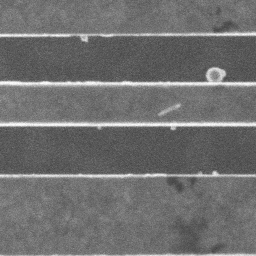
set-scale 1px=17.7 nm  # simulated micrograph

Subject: lines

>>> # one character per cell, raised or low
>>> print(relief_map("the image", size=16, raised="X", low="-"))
XXXXXXXXXXXXXXXX
XXXXXXXXXXXXXXXX
----------------
----------------
----------------
XXXXXXXXXXXXXXXX
XXXXXXXXXXXXXXXX
XXXXXXXXXXXXXXXX
----------------
----------------
----------------
XXXXXXXXXXXXXXXX
XXXXXXXXXXXXXXXX
XXXXXXXXXXXXXXXX
XXXXXXXXXXXXXXXX
XXXXXXXXXXXXXXXX